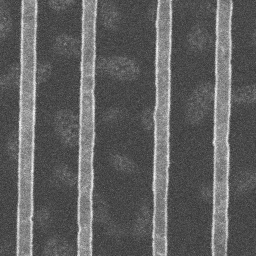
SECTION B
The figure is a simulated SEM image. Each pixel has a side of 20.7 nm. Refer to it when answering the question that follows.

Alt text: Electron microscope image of one or a few lines or trenches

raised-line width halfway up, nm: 272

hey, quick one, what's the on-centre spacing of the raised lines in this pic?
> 1.35 µm